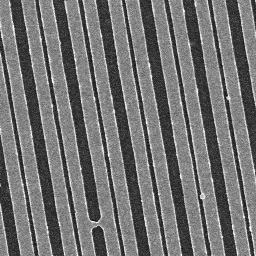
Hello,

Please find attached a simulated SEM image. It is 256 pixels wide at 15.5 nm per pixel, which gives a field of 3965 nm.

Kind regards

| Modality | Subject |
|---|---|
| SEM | parallel lines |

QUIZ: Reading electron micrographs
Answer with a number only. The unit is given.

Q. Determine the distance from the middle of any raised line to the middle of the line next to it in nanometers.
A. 329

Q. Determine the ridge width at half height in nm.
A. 202